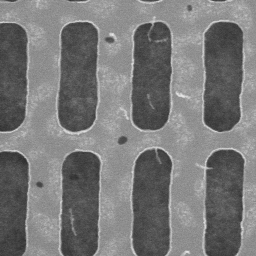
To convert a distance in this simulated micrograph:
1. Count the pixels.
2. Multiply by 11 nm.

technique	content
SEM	holes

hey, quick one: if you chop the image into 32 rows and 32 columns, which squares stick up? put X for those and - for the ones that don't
XXXXXXXXXXXXXXXXXXXXXXXXXXXXXXXX
XXXXXXXXXXXXXXXXXXXXXXXXXXXXXXXX
XXXXXXXXXXXXXXXXXXXXXXXXXXXXXXXX
---XXXXX----XXXXX----XXXXX----XX
---XXXXX----XXXXX----XXXXX----XX
---XXXXX----XXXXX----XXXXX----XX
---XXXXX----XXXXX----XXXXX----XX
---XXXXX----XXXXX----XXXX-----XX
---XXXX-----XXXXX----XXXXX----XX
---XXXX-----XXXXX----XXXXX----XX
---XXXX-----XXXX-----XXXXX----XX
---XXXX-----XXXX-----XXXX-----XX
---XXXX-----XXXX-----XXXX-----XX
---XXXX-----XXXX-----XXXX-----XX
---XXXX-----XXXX-----XXXX-----XX
---XXXXX----XXXXX----XXXXX----XX
-XXXXXXXXXXXXXXXXXXXXXXXXXXXXXXX
XXXXXXXXXXXXXXXXXXXXXXXXXXXXXXXX
XXXXXXXXXXXXXXXXXXXXXXXXXXXXXXXX
---XXXXX----XXXXX----XXXXX----XX
----XXXX-----XXXX----XXXXX-----X
----XXXX-----XXXX----XXXXX-----X
----XXXX----XXXXX----XXXXX----XX
----XXXX----XXXXX----XXXXX----XX
---XXXXX----XXXXX----XXXXX----XX
---XXXXX----XXXXX----XXXXX----XX
---XXXXX----XXXXX----XXXXX----XX
---XXXXX----XXXXX----XXXXX----XX
---XXXXX----XXXXX----XXXXX----XX
---XXXXX----XXXXX----XXXXX----XX
---XXXXX----XXXXX----XXXXX----XX
---XXXXX----XXXXX----XXXXX----XX